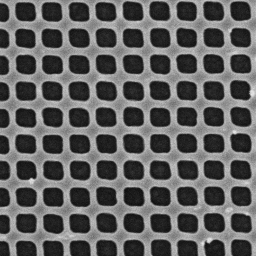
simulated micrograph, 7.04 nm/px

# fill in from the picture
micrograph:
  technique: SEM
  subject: a regular array of holes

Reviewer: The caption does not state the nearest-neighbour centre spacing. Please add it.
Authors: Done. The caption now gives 185 nanometers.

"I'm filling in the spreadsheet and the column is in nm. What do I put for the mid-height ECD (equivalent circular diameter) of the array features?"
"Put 151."